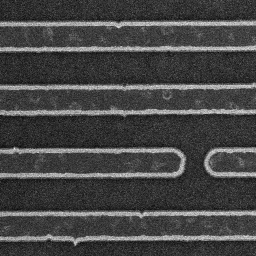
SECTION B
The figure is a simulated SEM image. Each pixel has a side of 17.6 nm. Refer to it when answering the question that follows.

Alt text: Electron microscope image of one or a few lines or trenches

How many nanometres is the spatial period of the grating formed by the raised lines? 1110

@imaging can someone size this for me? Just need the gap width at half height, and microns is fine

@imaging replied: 0.683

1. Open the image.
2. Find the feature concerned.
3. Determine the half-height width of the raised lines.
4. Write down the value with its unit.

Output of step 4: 431 nm